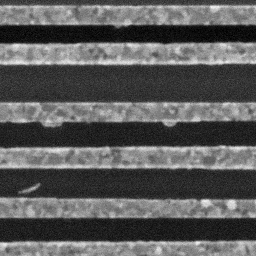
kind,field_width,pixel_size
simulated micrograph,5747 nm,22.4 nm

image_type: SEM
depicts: lines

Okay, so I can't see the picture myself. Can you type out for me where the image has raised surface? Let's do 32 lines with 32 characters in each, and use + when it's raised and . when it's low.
................................
++++++++++++++++++++++++++++++++
++++++++++++++++++++++++++++++++
................................
................................
.........++++..+++++...+++++++++
++++++++++++++++++++++++++++++++
++++++++++++++++++++++++++++++++
................................
................................
................................
................................
................................
++++++++++++++++++++++++++++++++
++++++++++++++++++++++++++++++++
................................
................................
................................
..............+.++++++.+++++++++
++++++++++++++++++++++++++++++++
++++++++++++++++++++++++++++++++
................................
................................
................................
................................
++++++++++++++++++++++++++++++++
++++++++++++++++++++++++++++++++
................................
................................
................................
++++++++++++++++++++++++++++++++
++++++++++++++++++++++++++++++++